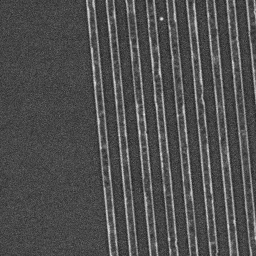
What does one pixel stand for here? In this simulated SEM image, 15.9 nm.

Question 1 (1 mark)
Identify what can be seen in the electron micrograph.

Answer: parallel lines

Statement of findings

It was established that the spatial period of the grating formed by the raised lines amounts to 317 nm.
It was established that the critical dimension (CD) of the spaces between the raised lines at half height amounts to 196 nm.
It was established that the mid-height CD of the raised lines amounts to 115 nm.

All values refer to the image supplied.